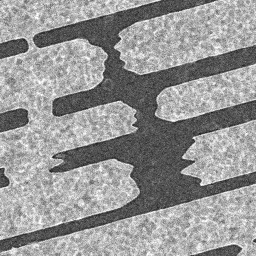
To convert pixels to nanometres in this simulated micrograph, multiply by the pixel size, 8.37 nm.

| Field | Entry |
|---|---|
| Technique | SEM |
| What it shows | one or a few lines or trenches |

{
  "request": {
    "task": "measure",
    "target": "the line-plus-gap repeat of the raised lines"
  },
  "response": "521 nm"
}